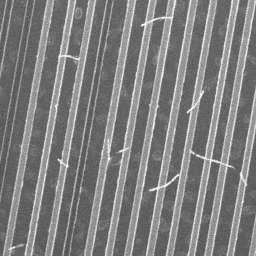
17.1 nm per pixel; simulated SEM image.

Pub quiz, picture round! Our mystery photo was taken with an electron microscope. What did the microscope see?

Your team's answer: parallel lines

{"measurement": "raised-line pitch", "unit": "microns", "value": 0.341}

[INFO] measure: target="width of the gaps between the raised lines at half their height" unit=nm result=234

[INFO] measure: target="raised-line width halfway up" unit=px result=6.78